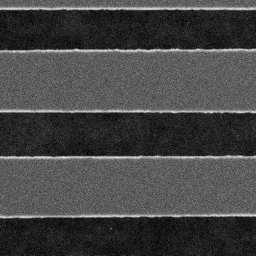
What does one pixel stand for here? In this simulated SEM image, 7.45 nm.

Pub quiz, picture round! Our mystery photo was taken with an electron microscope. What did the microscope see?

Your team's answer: lines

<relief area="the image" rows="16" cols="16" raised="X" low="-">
XXXXXXXXXXXXXXXX
----------------
----------------
XXXXXXXXXXXXXXXX
XXXXXXXXXXXXXXXX
XXXXXXXXXXXXXXXX
XXXXXXXXXXXXXXXX
----------------
----------------
----------------
XXXXXXXXXXXXXXXX
XXXXXXXXXXXXXXXX
XXXXXXXXXXXXXXXX
XXXXXXXXXXXX----
----------------
----------------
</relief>